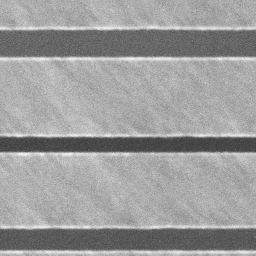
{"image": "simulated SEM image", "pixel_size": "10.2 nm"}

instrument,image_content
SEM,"lines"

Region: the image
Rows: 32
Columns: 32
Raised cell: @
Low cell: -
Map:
@@@@@@@@@@@@@@@@@@@@@@@@@@@@@@@@
@@@@@@@@@@@@@@@@@@@@@@@@@@@@@@@@
@@@@@@@@@@@@@@@@@@@@@@@@@@@@@@@@
@@@@@@@@@@@@@@@@@@@@@@@@@@@@@@@@
--------------------------------
--------------------------------
--------------------------------
@@@@@@@@@@@@@@@@@@@@@@@@@@@@@@@@
@@@@@@@@@@@@@@@@@@@@@@@@@@@@@@@@
@@@@@@@@@@@@@@@@@@@@@@@@@@@@@@@@
@@@@@@@@@@@@@@@@@@@@@@@@@@@@@@@@
@@@@@@@@@@@@@@@@@@@@@@@@@@@@@@@@
@@@@@@@@@@@@@@@@@@@@@@@@@@@@@@@@
@@@@@@@@@@@@@@@@@@@@@@@@@@@@@@@@
@@@@@@@@@@@@@@@@@@@@@@@@@@@@@@@@
@@@@@@@@@@@@@@@@@@@@@@@@@@@@@@@@
@@@@@@@@@@@@@@@@@@@@@@@@@@@@@@@@
--------------------------------
--------------------------------
@@@@@@@@@@@@@@@@@@@@@@@@@@@@@@@@
@@@@@@@@@@@@@@@@@@@@@@@@@@@@@@@@
@@@@@@@@@@@@@@@@@@@@@@@@@@@@@@@@
@@@@@@@@@@@@@@@@@@@@@@@@@@@@@@@@
@@@@@@@@@@@@@@@@@@@@@@@@@@@@@@@@
@@@@@@@@@@@@@@@@@@@@@@@@@@@@@@@@
@@@@@@@@@@@@@@@@@@@@@@@@@@@@@@@@
@@@@@@@@@@@@@@@@@@@@@@@@@@@@@@@@
@@@@@@@@@@@@@@@@@@@@@@@@@@@@@@@@
--------------------------------
--------------------------------
--------------------------------
@@@@@@@@@@@@@@@@@@@@@@@@@@@@@@@@